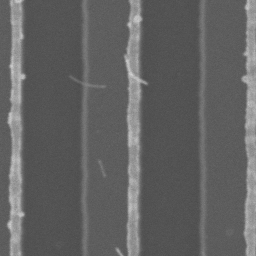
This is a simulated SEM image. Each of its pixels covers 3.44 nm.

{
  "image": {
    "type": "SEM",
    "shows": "lines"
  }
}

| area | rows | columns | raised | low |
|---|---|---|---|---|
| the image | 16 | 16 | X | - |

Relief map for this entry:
X----XXXX----XXX
X----XXXX----XXX
X----XXXX----XXX
X----XXXX----XXX
X----XXXX----XXX
X----XXXX----XXX
X----XXXX----XXX
X----XXXX----XXX
X----XXXX----XXX
X----XXXX----XXX
X----XXXX----XXX
X----XXXX----XXX
X----XXXX----XXX
X----XXXX----XXX
X----XXXX----XXX
X----XXXX----XXX